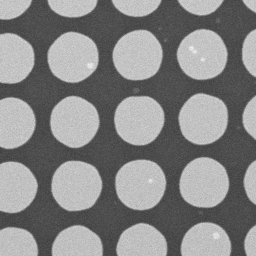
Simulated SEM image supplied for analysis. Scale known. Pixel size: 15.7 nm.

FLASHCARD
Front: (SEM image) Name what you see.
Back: an array of small figures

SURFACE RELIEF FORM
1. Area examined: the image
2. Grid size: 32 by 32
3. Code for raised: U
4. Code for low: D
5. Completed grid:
UUUUDDUUUUUUDDUUUUUUDDDUUUUUDDDU
UUUDDDDUUUUDDDDUUUUDDDDDUUDDDDDD
DDDDDDDDDDDDDDDDDDDDDDDDDDDDDDDD
DDDDDDDDDDDDDDDDDDDDDDDDDDDDDDDD
UUDDDDDDUUUDDDDUUUUDDDDUUUUDDDDU
UUUUDDDUUUUUDDDUUUUUDDDUUUUUDDUU
UUUUDDUUUUUUDDUUUUUUDDUUUUUUDDUU
UUUUDDUUUUUUDDUUUUUUDDUUUUUUDDUU
UUUUDDUUUUUUDDDUUUUUDDDUUUUUDDDU
UUUDDDDUUUUDDDDUUUUDDDDDUUUDDDDD
DDDDDDDDDDDDDDDDDDDDDDDDDDDDDDDD
DDDDDDDDDDDDDDDDDDDDDDDDDDDDDDDD
UUUDDDDDUUUDDDDDUUUDDDDDUUUUDDDU
UUUUDDDUUUUUDDDUUUUUDDDUUUUUDDDU
UUUUDDUUUUUUDDUUUUUUUDUUUUUUDDUU
UUUUDDUUUUUUDDUUUUUUDDDUUUUUDDUU
UUUUDDDUUUUUDDDUUUUUDDDUUUUUDDDU
UUUDDDDUUUUDDDDDUUUDDDDDUUUDDDDD
DUDDDDDDDDDDDDDDDDDDDDDDDDDDDDDD
DDDDDDDDDDDDDDDDDDDDDDDDDDDDDDDD
UUUDDDDDUUUDDDDDUUUDDDDDUUUDDDDU
UUUUDDDUUUUUDDDUUUUUDDDUUUUUDDDU
UUUUDDDUUUUUUDDUUUUUUDDUUUUUDDDU
UUUUUDDUUUUUUDDUUUUUUDDUUUUUUDDU
UUUUDDDUUUUUDDDUUUUUDDDUUUUUDDDU
UUUUDDDUUUUUDDDDUUUUDDDDUUUDDDDD
DUDDDDDDDDDDDDDDDDDDDDDDDDDDDDDD
DDDDDDDDDDDDDDDDDDDDDDDDDDDDDDDD
DDDDDDDDDUUDDDDDUUUDDDDDUUUUDDDD
UUUUDDDUUUUUDDDUUUUUDDDUUUUUDDDU
UUUUUDDUUUUUUDDUUUUUUDDUUUUUUDDU
UUUUUDDUUUUUUDDUUUUUUDDUUUUUUDDU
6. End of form